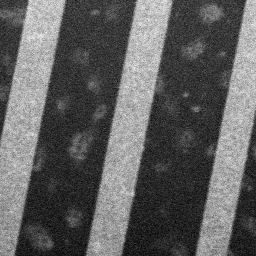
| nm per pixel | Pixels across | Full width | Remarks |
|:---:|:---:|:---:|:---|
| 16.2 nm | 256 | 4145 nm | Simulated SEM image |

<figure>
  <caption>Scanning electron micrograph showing one or a few lines or trenches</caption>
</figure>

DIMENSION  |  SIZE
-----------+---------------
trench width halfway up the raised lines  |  1190 nm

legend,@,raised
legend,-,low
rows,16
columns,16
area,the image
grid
--@@-----@@----@
--@@----@@-----@
-@@@----@@-----@
-@@-----@@-----@
-@@-----@@-----@
-@@-----@@----@@
-@@----@@-----@@
@@@----@@-----@@
@@-----@@-----@@
@@-----@@-----@-
@@-----@@----@@-
@@----@@-----@@-
@@----@@-----@@-
@-----@@-----@@-
@-----@@-----@--
@-----@@----@@--